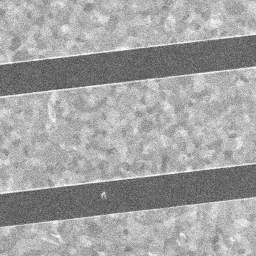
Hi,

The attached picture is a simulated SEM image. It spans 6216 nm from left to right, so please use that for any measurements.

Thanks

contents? one or a few lines or trenches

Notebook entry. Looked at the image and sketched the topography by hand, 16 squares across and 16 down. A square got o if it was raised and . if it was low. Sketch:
oooooooooooooooo
oooooooooooooooo
ooooooooooooo...
oooo............
.............ooo
.....ooooooooooo
oooooooooooooooo
oooooooooooooooo
oooooooooooooooo
oooooooooooooooo
oooooooooooooo..
ooo.o...........
...............o
......oooooooooo
oooooooooooooooo
oooooooooooooooo